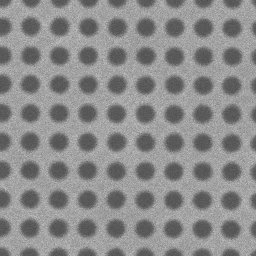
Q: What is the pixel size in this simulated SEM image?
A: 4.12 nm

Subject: a regular array of holes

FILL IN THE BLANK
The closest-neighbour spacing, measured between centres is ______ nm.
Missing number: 117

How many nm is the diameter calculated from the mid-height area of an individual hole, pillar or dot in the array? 77.9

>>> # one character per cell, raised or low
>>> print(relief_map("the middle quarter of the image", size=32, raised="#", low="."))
################################
################################
################################
#####...####...####...####...###
.###....###.....##.....###....##
.###.....##.....##.....##.....##
.###....###....###....####....##
############..#####..######.####
################################
################################
####...#####...####...####...###
.###....###....###.....##.....##
.###....###.....##.....##.....##
.###....###....###.....##.....##
#####..#####..#####...####...###
################################
################################
#####..#####..######.#####...###
.###....###....###....###.....##
.##.....###.....##.....##.....##
.###....###....###.....##.....##
####...#####..#####...####...###
################################
################################
#####..#####..##################
.###....###....###....####...###
.##.....###....###.....##.....##
.###....###....###.....##.....##
####...####....####...####...###
################################
################################
################################